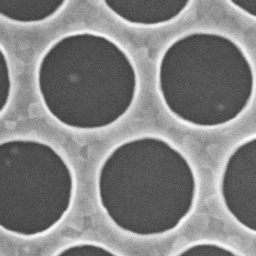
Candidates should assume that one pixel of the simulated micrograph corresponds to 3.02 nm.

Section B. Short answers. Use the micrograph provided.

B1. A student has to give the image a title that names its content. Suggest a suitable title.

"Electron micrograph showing holes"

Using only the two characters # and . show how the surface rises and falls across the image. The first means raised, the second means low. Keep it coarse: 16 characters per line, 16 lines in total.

....###....####.
################
####...####...##
###.....##.....#
##......##......
.##.....##......
###.....##.....#
####...#####..##
################
...####....####.
....##......##..
....##......##..
....##......##..
....###.....###.
#..#####..######
####..######..##